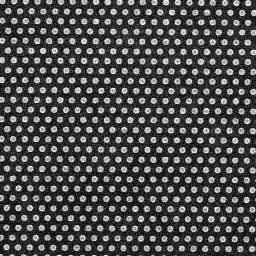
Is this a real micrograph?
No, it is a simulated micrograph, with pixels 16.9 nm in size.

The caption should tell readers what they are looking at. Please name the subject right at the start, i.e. a regular array of raised bodies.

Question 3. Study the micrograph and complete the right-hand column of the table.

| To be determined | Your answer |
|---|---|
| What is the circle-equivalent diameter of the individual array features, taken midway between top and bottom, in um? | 0.0934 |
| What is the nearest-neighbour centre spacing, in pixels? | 11.3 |